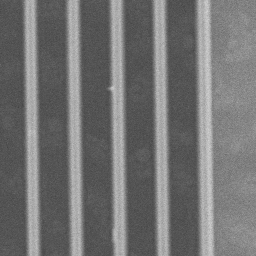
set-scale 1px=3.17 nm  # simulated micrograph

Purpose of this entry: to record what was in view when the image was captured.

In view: parallel lines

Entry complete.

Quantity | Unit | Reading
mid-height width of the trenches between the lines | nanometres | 99.9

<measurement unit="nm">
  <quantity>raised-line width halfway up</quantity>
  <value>37.3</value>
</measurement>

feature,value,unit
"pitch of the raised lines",137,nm